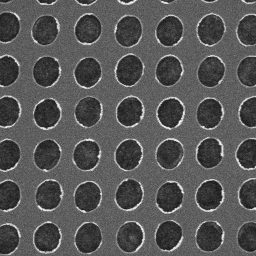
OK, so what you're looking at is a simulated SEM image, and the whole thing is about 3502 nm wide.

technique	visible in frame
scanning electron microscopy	a regular array of holes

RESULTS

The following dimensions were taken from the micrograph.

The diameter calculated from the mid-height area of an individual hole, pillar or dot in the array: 384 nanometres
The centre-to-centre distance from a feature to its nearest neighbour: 0.539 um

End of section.